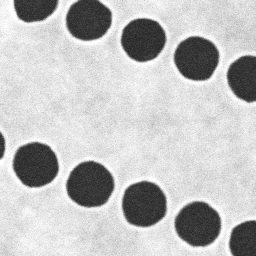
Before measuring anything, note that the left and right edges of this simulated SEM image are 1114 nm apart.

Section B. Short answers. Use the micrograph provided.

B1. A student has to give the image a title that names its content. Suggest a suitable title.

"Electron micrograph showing holes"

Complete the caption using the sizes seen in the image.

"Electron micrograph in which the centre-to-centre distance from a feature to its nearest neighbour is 250 nanometers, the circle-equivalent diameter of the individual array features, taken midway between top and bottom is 200 nm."